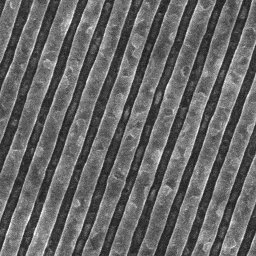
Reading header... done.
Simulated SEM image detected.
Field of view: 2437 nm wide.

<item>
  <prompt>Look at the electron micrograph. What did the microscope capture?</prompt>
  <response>parallel lines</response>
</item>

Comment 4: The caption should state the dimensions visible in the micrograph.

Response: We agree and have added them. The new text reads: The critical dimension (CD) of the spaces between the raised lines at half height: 0.0943 microns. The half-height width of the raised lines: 150 nm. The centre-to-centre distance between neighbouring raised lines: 247 nm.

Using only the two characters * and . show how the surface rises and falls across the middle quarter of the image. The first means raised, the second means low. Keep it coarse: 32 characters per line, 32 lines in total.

.****..****...****...****...****
****...****...****..*****..*****
****..*****..*****..****...*****
***...****...****...****...****.
***...****...****...****..*****.
***..*****..*****..****...****..
***..****...****...****..*****..
**...****...****...***.*.*****..
**..****...*****..****.*.****...
**..****...****...****..*****...
*...****...****..*****..*****..*
*..****...*****..****...****...*
...****...****.*.****...****...*
...****...****..*****..*****...*
..****...*****..****...****...**
..****...****...****..*****...**
.*****...****..*****..*****..***
.****...****...****...****...***
.****...****...****...****...***
.****..*****..*****..*****..****
*****..****...****...****...****
****...****...****..*****..*****
****..****...******.*****..*****
****..****...****...****...****.
***...****...****..*****..*****.
***..*****..****...*****..****..
**...****...****...****...****..
**..*****...****..*****..*****..
**..*****..****...*****..****...
*...****...****...****...****...
*..*****...****..*****..*****..*
*..*****..****...****...*****..*